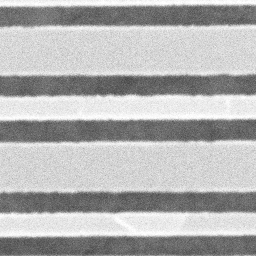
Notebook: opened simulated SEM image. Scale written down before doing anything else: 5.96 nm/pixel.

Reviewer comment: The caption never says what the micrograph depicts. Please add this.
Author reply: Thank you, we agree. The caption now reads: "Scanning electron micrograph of lines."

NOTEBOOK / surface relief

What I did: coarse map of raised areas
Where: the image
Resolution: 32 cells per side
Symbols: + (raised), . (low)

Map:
+++++++++++++++++++++...........
................................
................................
+.+.++++++++++++++++++++++++++++
++++++++++++++++++++++++++++++++
++++++++++++++++++++++++++++++++
++++++++++++++++++++++++++++++++
++++++++++++++++++++++++++++++++
++++++++++++++++++++++++++++++++
................................
................................
................................
++++++++++++++++++++++++++++++++
++++++++++++++++++++++++++++++++
++++++++++++++++++++++++++++++++
................................
................................
................................
++++++++++++++++++++++++++++++++
++++++++++++++++++++++++++++++++
++++++++++++++++++++++++++++++++
++++++++++++++++++++++++++++++++
++++++++++++++++++++++++++++++++
++++++++++++++++++++++++++++++++
................................
................................
................................
++++++++++++++++++++++++++++++++
++++++++++++++++++++++++++++++++
................................
................................
................................